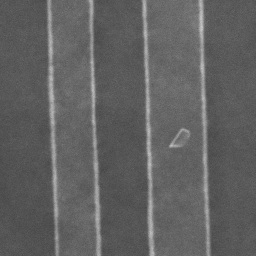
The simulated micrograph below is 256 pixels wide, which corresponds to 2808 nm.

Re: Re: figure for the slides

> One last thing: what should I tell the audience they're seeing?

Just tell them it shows lines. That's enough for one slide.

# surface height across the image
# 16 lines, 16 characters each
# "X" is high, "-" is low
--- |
---XXX---XXXX---
---XXX---XXXX---
---XXX---XXXX---
---XXX---XXXX---
---XXX---XXXX---
---XXX---XXXX---
---XXX---XXXX---
---XXX---XXXX---
---XXX---XXXX---
---XXX---XXXX---
---XXX---XXXX---
---XXX---XXXX---
----XX---XXXX---
----XX---XXXX---
----XX---XXXX---
----XX---XXXX---